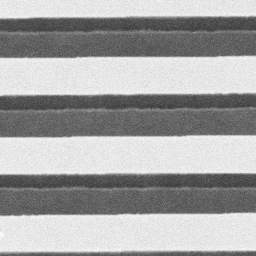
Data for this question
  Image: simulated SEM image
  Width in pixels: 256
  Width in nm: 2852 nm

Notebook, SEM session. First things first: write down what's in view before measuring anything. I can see lines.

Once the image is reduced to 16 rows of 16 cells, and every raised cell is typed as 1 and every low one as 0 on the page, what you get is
1111111111111111
0000000000000000
0000000000000000
0000000000000000
1111111111111111
1111111111111111
0000000000000000
0000000000000000
0000000000000000
1111111111111111
1111111111111111
0000000000000000
0000000000000000
1111111111111111
1111111111111111
1111111111111111